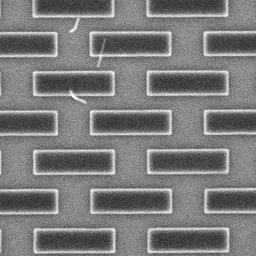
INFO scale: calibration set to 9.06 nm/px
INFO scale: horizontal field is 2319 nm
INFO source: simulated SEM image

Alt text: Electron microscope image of groups of lines, slits or small figures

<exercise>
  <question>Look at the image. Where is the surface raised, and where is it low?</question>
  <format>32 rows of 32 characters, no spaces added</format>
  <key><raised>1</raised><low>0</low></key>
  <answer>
00001111111111000011111111110000
00001111111111000011111111110000
00000000000000000000000000000000
00000000000000000000000000000000
11111110000111111111100000111111
11111110000111111111100000111111
11111110000111111111100000111111
00000000000000000000000000000000
00000000000000000000000000000000
00001111111111000011111111110000
00001111111111000011111111110000
00001111111111000011111111110000
00000000000000000000000000000000
00000000000000000000000000000000
11111110000111111111100000111111
11111110000111111111100000111111
11111110000111111111100000111111
00000000000000000000000000000000
00000000000000000000000000000000
00001111111111000001111111110000
00001111111111000001111111110000
00001111111111000001111111110000
00000000000000000000000000000000
00000000000000000000000000000000
11111110000111111111100000111111
11111110000111111111100000111111
11111110000011111111100000111111
00000000000000000000000000000000
00000000000000000000000000000000
00001111111111000001111111110000
00001111111111000001111111111000
00000111111111000001110000000000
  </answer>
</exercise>